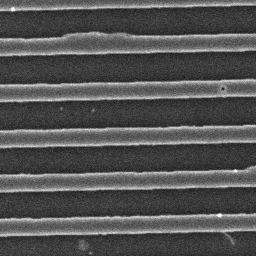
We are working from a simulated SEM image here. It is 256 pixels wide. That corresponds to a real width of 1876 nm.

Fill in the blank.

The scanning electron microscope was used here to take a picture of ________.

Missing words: lines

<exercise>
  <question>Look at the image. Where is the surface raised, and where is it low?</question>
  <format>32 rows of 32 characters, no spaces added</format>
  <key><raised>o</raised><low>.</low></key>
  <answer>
oooooooooooooooooooooooooooooooo
................................
................................
................................
........oooooooo.......ooooooooo
oooooooooooooooooooooooooooooooo
ooooooooooooooooooo.............
................................
................................
................................
...........ooooooooooooooooooooo
oooooooooooooooooooooooooooooooo
ooooooo.........................
................................
................................
................................
oooooooooooooooooooooooooooooooo
oooooooooooooooooooooooooooooooo
................................
................................
................................
.....................ooooooooooo
oooooooooooooooooooooooooooooooo
ooooooooooooooooooooooo.........
................................
................................
................................
oooooooooooooooooooooooooooooooo
oooooooooooooooooooooooooooooooo
................................
................................
................................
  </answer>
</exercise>